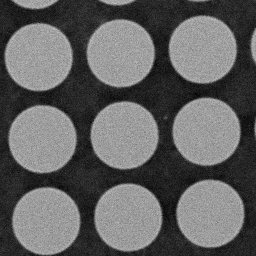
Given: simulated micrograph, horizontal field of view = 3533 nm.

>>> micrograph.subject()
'an array of small figures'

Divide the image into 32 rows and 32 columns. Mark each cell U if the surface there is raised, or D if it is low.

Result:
DDUUUUDDDDDDDDUUDDDDDDDDDDDDDDDD
DDDDDDDDDDDDDDDDDDDDDDDDDDDDDDDD
DDDDDDDDDDDDDDDDDDDDDDDUUUUDDDDD
DDDUUUUDDDDDUUUUUUDDDDUUUUUUUDDD
DDUUUUUUDDDDUUUUUUUDDDUUUUUUUDDD
DUUUUUUUUDDUUUUUUUUDDUUUUUUUUDDU
DUUUUUUUUDDUUUUUUUUDDUUUUUUUUDDU
DUUUUUUUUDDUUUUUUUUDDUUUUUUUUDDD
DUUUUUUUUDDUUUUUUUUDDDUUUUUUUDDD
DUUUUUUUDDDDUUUUUUDDDDDUUUUUDDDD
DDUUUUUDDDDDDUUUUDDDDDDDDDDDDDDD
DDDDDDDDDDDDDDDDDDDDDDDDDDDDDDDD
DDDDDDDDDDDDDDDDDDDDDDDDUUUDDDDD
DDDDUUUDDDDDDUUUUUDDDDDUUUUUUDDD
DDUUUUUUDDDDUUUUUUUDDDUUUUUUUUDD
DDUUUUUUUDDDUUUUUUUUDDUUUUUUUUDD
DUUUUUUUUDDUUUUUUUUUDDUUUUUUUUDD
DUUUUUUUUDDUUUUUUUUUDDUUUUUUUUDD
DUUUUUUUUDDDUUUUUUUDDDUUUUUUUDDD
DDUUUUUUUDDDUUUUUUUDDDDUUUUUUDDD
DDDUUUUUDDDDDUUUUUDDDDDDDUUDDDDD
DDDDDUDDDDDDDDDDDDDDDDDDDDDDDDDD
DDDDDDDDDDDDDDDDDDDDDDDDDDDDDDDD
DDDDDUDDDDDDDDUUUUDDDDDDUUUUUDDD
DDDUUUUUUDDDDUUUUUUDDDDUUUUUUUDD
DDUUUUUUUDDDUUUUUUUUDDUUUUUUUUDD
DDUUUUUUUUDDUUUUUUUUDDUUUUUUUUDD
DDUUUUUUUUDDUUUUUUUUDDUUUUUUUUDD
DDUUUUUUUUDDUUUUUUUUDDDUUUUUUUDD
DDUUUUUUUUDDDUUUUUUUDDDUUUUUUDDD
DDDUUUUUUDDDDDUUUUUDDDDDDUUUDDDD
DDDDUUUDDDDDDDDDDDDDDDDDDDDDDDDD